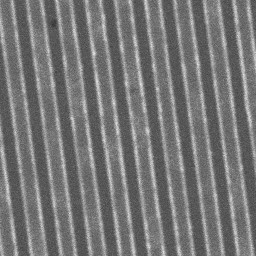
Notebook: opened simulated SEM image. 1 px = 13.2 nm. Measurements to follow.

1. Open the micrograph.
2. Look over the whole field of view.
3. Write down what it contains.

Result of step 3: parallel lines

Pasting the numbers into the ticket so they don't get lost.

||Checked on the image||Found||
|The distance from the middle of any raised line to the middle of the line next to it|386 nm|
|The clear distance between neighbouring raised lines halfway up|182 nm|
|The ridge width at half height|14.7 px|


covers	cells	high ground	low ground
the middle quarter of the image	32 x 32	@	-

@@@@----@@@----@@@@---@@@@----@@
@@@@----@@@@---@@@@---@@@@----@@
@@@@----@@@@---@@@@----@@@----@@
-@@@----@@@@---@@@@----@@@----@@
-@@@@---@@@@---@@@@----@@@@---@@
-@@@@---@@@@---@@@@----@@@@----@
-@@@@---@@@@----@@@@---@@@@----@
-@@@@----@@@----@@@@---@@@@----@
-@@@@----@@@----@@@@----@@@----@
-@@@@----@@@@---@@@@----@@@----@
--@@@----@@@@---@@@@----@@@----@
--@@@----@@@@---@@@@----@@@----@
--@@@@---@@@@----@@@----@@@@---@
--@@@@---@@@@----@@@@---@@@@---@
--@@@@---@@@@----@@@@---@@@@----
--@@@@---@@@@----@@@@---@@@@----
--@@@@----@@@@---@@@@----@@@----
---@@@----@@@@---@@@@----@@@----
---@@@----@@@@---@@@@----@@@@---
---@@@@---@@@@----@@@----@@@@---
---@@@@---@@@@----@@@----@@@@---
---@@@@---@@@@----@@@@---@@@@---
---@@@@----@@@----@@@@---@@@@---
---@@@@----@@@----@@@@----@@@---
----@@@----@@@@---@@@@----@@@---
----@@@----@@@@---@@@@----@@@@--
----@@@----@@@@---@@@@----@@@@--
----@@@@---@@@@----@@@----@@@@--
----@@@@---@@@@----@@@----@@@@--
----@@@@---@@@@----@@@----@@@@--
@---@@@@----@@@----@@@@---@@@@--
@----@@@----@@@@---@@@@---@@@@--